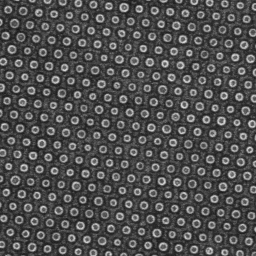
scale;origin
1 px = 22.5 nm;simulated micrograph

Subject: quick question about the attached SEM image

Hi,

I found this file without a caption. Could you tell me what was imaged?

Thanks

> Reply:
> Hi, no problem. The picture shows a regular array of raised bodies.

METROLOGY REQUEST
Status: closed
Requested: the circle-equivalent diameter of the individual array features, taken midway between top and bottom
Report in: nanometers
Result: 154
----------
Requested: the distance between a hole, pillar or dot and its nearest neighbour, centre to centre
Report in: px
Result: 14.9